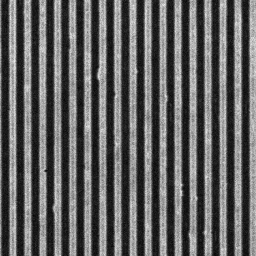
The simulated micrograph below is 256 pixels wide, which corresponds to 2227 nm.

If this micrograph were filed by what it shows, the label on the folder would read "parallel lines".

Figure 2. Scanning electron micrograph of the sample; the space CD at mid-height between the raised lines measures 69.6 nm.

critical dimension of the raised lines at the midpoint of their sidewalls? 62 nanometers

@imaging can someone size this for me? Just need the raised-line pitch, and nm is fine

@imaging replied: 131